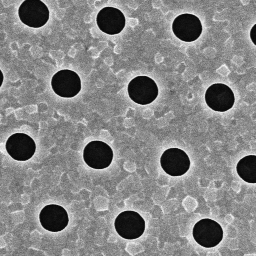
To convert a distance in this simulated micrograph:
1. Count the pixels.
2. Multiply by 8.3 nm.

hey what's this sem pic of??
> a regular array of holes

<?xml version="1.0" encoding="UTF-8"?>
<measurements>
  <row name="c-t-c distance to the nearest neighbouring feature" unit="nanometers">637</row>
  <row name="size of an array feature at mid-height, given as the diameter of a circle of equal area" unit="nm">244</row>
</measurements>